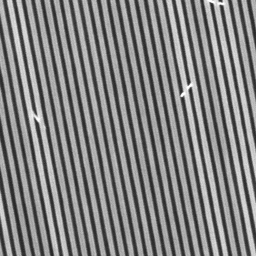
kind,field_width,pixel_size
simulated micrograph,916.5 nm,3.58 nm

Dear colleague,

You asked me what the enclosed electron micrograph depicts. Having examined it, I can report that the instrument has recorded parallel lines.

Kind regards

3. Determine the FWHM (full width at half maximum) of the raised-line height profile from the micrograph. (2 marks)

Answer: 0.0167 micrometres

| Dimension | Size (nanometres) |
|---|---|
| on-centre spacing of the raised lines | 33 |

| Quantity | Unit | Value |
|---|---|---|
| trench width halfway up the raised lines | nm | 16.7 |